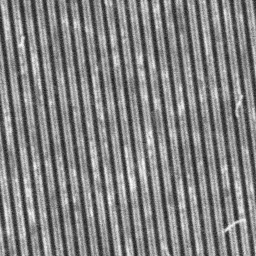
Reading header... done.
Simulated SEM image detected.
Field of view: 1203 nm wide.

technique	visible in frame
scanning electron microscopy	parallel lines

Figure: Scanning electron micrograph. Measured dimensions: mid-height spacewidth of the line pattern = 0.0256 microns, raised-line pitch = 54.4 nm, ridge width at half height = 29.7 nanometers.